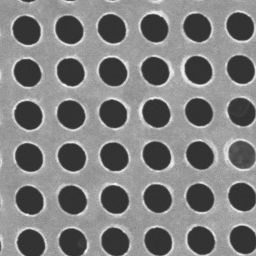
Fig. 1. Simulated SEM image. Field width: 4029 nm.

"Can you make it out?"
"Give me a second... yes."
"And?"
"a regular array of holes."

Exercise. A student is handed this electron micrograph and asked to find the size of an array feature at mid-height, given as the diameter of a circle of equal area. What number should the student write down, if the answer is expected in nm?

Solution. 456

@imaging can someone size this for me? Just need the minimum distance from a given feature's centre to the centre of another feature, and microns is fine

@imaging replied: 0.667